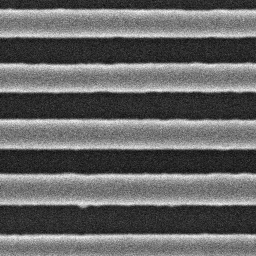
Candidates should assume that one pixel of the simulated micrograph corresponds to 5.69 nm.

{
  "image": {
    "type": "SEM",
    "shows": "lines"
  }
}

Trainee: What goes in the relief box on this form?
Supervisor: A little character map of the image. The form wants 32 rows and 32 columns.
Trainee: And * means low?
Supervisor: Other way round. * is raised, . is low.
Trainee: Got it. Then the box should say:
................................
********************************
********************************
********************************
********************************
................................
................................
................................
********************************
********************************
********************************
*.*******.**...****.............
................................
................................
................................
********************************
********************************
********************************
**************.*****************
................................
................................
................................
********************************
********************************
********************************
********************************
................................
................................
................................
********************************
********************************
********************************